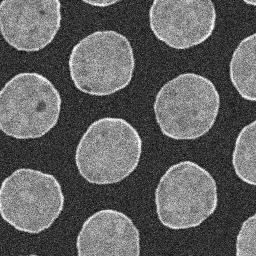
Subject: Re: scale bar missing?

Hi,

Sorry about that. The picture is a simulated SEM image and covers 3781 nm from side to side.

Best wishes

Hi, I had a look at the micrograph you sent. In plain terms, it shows raised bodies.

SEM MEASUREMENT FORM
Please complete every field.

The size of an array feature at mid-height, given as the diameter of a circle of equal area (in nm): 944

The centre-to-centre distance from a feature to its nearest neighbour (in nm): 1310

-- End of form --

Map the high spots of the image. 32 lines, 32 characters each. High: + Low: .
+++++++.....++.....++++++++.....
+++++++............++++++++.....
+++++++............++++++++.....
+++++++............++++++++.....
.++++++....++++.....++++++.....+
.+++++....++++++.....++++.....++
.........+++++++.............+++
.........++++++++............+++
.........++++++++............+++
..+++....+++++++.......++....+++
.+++++....++++++.....+++++...+++
+++++++....+++......+++++++...++
+++++++.............+++++++.....
+++++++............++++++++.....
+++++++.............+++++++.....
+++++++.....++++....+++++++....+
.+++++.....++++++....+++++....++
..........+++++++.............++
..........+++++++............+++
..........+++++++............+++
..........+++++++.....++.....+++
..+++.....++++++.....+++++....++
.++++++....++++.....+++++++....+
+++++++.............+++++++.....
++++++++............+++++++.....
++++++++............+++++++.....
+++++++......+......++++++......
.++++++....+++++....+++++......+
..++++....+++++++.....+.......++
..........+++++++.............++
..........+++++++.............++
..........+++++++.............++